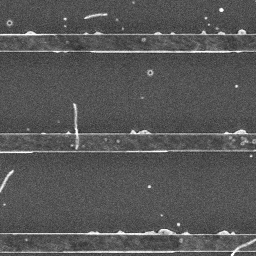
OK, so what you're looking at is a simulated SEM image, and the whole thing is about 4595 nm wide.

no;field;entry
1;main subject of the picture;lines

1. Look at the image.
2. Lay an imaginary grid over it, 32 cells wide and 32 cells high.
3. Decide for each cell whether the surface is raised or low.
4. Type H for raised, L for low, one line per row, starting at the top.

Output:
LLLLLLLLLLLLLLLLLLLLLLLLLLLLLLLL
LLLLLLLLLLLLLLLLLLLLLLLLLLLLLLLL
LLLLLLLLLLLLLLLLLLLLLLLLLLLLLLLL
LLLLLLLLLLLLLLLLLLLLLLLLLLLLLLLL
HHHHHHHHHHHHHHHHHHHHHHHHHHHHHHHH
HHHHHHHHHHHHHHHHHHHHHHHHHHHHHHHH
LLLLLLLLLLLLLLLLLLLLLLLLLLLLLLLL
LLLLLLLLLLLLLLLLLLLLLLLLLLLLLLLL
LLLLLLLLLLLLLLLLLLLLLLLLLLLLLLLL
LLLLLLLLLLLLLLLLLLLLLLLLLLLLLLLL
LLLLLLLLLLLLLLLLLLLLLLLLLLLLLLLL
LLLLLLLLLLLLLLLLLLLLLLLLLLLLLLLL
LLLLLLLLLLLLLLLLLLLLLLLLLLLLLLLL
LLLLLLLLLLLLLLLLLLLLLLLLLLLLLLLL
LLLLLLLLLLLLLLLLLLLLLLLLLLLLLLLL
LLLLLLLLLLLLLLLLLLLLLLLLLLLLLLLL
LLLLLLLLLLLLLLLLLLLLLLLLLLLLLLLL
HHHHHHHHHHHHHHHHHHHHHHHHHHHHHHHH
HHHHHHHHHHHHHHHHHHHHHHHHHHHHHHHH
LLLLLLLLLLLLLLLLLLLLLLLLLLLLLLLL
LLLLLLLLLLLLLLLLLLLLLLLLLLLLLLLL
LLLLLLLLLLLLLLLLLLLLLLLLLLLLLLLL
LLLLLLLLLLLLLLLLLLLLLLLLLLLLLLLL
LLLLLLLLLLLLLLLLLLLLLLLLLLLLLLLL
LLLLLLLLLLLLLLLLLLLLLLLLLLLLLLLL
LLLLLLLLLLLLLLLLLLLLLLLLLLLLLLLL
LLLLLLLLLLLLLLLLLLLLLLLLLLLLLLLL
LLLLLLLLLLLLLLLLLLLLLLLLLLLLLLLL
LLLLLLLLLLLLLLLLLLLLLLLLLLLLLLLL
HHHHHHHHHHHHHHHHHHHHHHHHHHHHHHHH
HHHHHHHHHHHHHHHHHHHHHHHHHHHHHHHH
LLLLLLLLLLLLLLLLLLLLLLLLLLLLLHLL